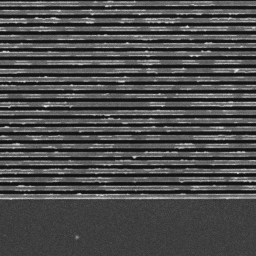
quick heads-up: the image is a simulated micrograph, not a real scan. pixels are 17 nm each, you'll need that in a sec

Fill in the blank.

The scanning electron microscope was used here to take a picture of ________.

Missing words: parallel lines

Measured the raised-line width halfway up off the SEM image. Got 78.7 nanometers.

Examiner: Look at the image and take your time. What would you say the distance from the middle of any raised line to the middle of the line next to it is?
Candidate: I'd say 142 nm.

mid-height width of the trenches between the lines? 61.7 nanometers